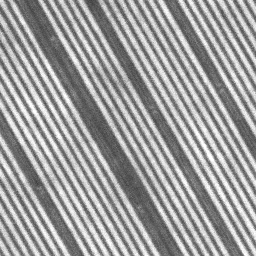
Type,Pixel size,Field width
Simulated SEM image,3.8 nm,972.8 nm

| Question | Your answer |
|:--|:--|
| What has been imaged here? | parallel lines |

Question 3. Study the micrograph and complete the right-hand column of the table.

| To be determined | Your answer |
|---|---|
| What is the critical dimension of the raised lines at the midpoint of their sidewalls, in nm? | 13.2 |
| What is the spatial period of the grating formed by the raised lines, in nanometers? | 32.8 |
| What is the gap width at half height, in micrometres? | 0.0198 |